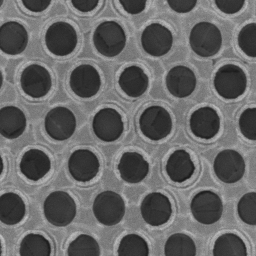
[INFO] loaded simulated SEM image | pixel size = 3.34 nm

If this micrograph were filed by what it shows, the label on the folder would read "a regular array of holes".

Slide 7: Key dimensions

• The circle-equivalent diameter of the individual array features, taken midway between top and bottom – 0.109 µm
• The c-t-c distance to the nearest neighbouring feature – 157 nm